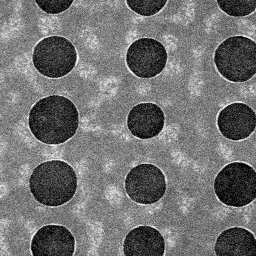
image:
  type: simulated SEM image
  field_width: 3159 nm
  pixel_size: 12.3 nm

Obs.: holes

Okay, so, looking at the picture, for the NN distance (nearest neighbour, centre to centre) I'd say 777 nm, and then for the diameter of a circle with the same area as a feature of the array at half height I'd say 528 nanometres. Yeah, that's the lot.